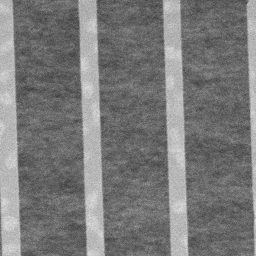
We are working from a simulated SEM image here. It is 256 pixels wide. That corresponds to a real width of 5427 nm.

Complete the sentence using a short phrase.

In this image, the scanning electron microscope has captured one or a few lines or trenches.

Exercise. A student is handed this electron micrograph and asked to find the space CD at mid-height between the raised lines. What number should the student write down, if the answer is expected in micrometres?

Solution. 1.42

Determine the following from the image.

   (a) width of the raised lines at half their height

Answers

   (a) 352 nm